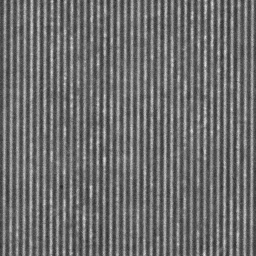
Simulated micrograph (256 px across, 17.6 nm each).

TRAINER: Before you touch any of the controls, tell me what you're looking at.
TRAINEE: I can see parallel lines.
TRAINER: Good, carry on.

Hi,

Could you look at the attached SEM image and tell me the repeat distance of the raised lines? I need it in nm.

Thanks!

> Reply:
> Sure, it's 117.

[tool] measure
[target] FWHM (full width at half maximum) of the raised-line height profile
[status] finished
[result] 17.6 nanometers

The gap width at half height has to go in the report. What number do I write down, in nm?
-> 83.5